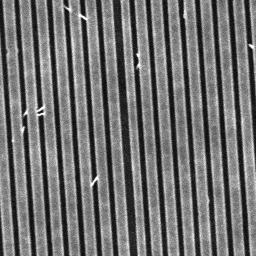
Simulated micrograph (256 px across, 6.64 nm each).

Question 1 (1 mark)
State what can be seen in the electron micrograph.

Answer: parallel lines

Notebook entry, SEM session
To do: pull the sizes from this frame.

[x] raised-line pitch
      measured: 109 nm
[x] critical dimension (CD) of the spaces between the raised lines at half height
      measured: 45.6 nm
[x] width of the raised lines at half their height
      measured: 0.0638 um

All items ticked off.